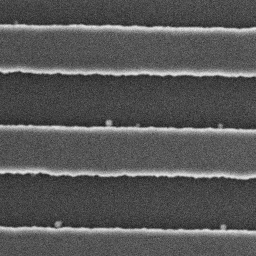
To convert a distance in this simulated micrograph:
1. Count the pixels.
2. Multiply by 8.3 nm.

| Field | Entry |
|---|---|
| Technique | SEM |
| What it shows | lines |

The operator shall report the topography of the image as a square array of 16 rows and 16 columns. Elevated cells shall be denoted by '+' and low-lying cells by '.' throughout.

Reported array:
................
................
++++++++++++++++
++++++++++++++++
..++++++++++++++
................
................
................
++++++++++++++++
++++++++++++++++
++++++++++++++++
................
................
................
++++++++++++++++
++++++++++++++++